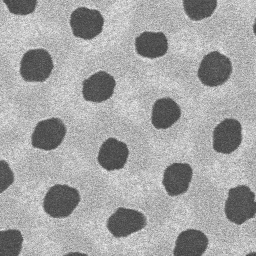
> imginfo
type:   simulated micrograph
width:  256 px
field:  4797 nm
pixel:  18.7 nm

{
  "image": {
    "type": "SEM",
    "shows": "a regular array of holes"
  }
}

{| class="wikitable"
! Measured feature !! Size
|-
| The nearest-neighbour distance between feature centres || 1240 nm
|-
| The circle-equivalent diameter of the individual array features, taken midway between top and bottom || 33.1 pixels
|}